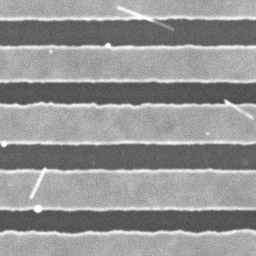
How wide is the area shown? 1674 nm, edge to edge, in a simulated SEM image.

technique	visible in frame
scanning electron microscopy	lines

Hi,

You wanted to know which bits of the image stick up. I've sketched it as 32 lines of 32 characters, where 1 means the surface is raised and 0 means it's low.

11111111111111111111111111111111
11111111111111111111111111111111
00000000000000000000000000000000
00000000000000000000000000000000
00000000000000000000000000000000
00000000000000000000000000000000
11111111111111111111111111111111
11111111111111111111111111111111
11111111111111111111111111111111
11111111111111111111111111111111
00000000000000000000000000000000
00000000000000000000000000000000
00000000000000000000000000000000
11111111111111111111111111111111
11111111111111111111111111111111
11111111111111111111111111111111
11111111111111111111111111111111
11111111111111111111111111111111
00000000000000000000000000000000
00000000000000000000000000000000
00000000000000000000000000000000
11111111111111111111111111111111
11111111111111111111111111111111
11111111111111111111111111111111
11111111111111111111111111111111
11111111111111111111111111111111
00000000000000000000000000000000
00000000000000000000000000000000
00000000000000000000000000000000
11111111111111111111111111111111
11111111111111111111111111111111
11111111111111111111111111111111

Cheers